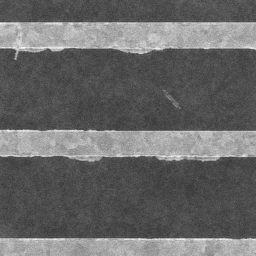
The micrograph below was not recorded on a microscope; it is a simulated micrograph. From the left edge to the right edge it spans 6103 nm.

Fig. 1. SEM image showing lines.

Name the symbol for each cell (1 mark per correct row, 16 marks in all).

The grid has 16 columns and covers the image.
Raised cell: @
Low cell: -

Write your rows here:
----------------
@@@@@@@@@@@@@@@@
@@@@@@@@@@@@@@@@
----------------
----------------
----------------
----------------
----------------
@@@@@@@@@@@@@@@@
@@@@@@@@@@@@@@@@
----------------
----------------
----------------
----------------
----------------
@@@@@@@@@@@@@@@@